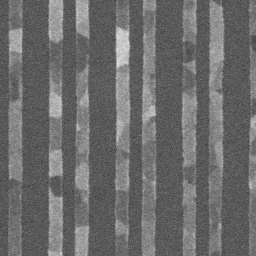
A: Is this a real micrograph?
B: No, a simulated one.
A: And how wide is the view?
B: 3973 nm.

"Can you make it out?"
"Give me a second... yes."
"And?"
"parallel lines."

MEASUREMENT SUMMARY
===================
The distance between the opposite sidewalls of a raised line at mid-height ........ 186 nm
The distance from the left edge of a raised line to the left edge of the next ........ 520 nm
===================